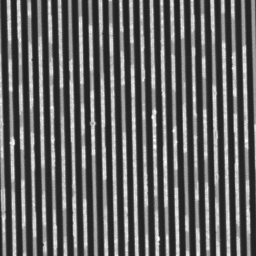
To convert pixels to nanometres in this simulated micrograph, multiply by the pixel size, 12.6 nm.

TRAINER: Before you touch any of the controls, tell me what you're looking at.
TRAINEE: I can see parallel lines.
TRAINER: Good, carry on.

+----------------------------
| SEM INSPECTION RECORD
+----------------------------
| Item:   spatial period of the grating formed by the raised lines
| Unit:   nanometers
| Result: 128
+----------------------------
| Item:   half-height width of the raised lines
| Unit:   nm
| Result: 48.8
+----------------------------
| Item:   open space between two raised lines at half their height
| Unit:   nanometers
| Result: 74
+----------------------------